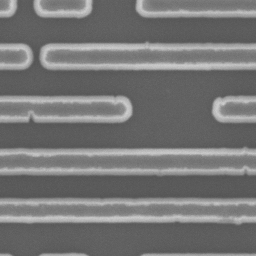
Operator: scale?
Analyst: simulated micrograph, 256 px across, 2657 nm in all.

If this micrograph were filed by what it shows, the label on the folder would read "parallel lines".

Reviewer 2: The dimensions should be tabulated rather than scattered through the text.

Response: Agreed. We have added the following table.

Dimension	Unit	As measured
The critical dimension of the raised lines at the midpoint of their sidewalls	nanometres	204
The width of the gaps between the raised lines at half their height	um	0.336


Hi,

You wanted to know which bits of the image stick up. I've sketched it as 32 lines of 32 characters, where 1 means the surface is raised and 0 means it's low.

11000111111000000111111111111111
10000111111000000011111111111111
00000000000000000000000000000000
00000000000000000000000000000000
00000000000000000000000000000000
00000000000000000000000000000000
11110011111111111111111111111111
11110111111111111111111111111111
00000000000000000000000000000000
00000000000000000000000000000000
00000000000000000000000000000000
00000000000000000000000000000000
11111111111111100000000000001111
11111111111111110000000000011111
11111111111111110000000000011111
00000000000000000000000000000000
00000000000000000000000000000000
00000000000000000000000000000000
00000000000000000000000000000000
11111111111111111111111111111111
11111111111111111111111111111111
00000000000000000001100000000000
00000000000000000000000000000000
00000000000000000000000000000000
00000000000000000000000000000000
11111111111111111111111111111111
11111111111111111111111111111111
00000000000000000000000000000100
00000000000000000000000000000000
00000000000000000000000000000000
00000000000000000000000000000000
00000000000000000000000000000000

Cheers